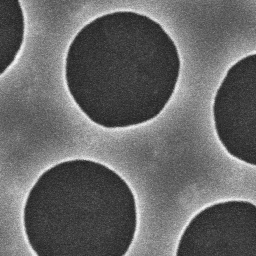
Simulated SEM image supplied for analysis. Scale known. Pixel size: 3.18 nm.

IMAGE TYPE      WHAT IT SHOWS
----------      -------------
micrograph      holes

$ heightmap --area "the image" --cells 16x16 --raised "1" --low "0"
0111111111111111
0011100000111111
0111100000011111
0111000000011110
1111000000011100
1111000000011100
1111100000111000
1111110001111000
1111111111111100
1111111111111100
1110000111111111
1100000011111111
1100000011111111
1000000001110000
1100000011100000
1100000011100000